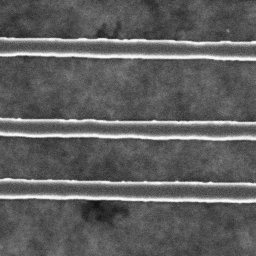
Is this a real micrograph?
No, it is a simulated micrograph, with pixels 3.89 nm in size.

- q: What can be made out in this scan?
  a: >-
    lines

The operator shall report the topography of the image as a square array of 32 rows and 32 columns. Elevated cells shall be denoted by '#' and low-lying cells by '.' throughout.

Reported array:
................................
................................
................................
................................
................................
################################
################################
................................
................................
................................
................................
................................
................................
................................
................................
################################
################################
................................
................................
................................
................................
................................
#####...........................
################################
################################
................................
................................
................................
................................
................................
................................
................................